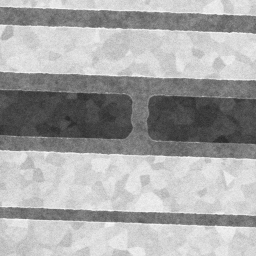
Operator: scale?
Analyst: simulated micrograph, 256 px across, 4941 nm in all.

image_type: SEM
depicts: one or a few lines or trenches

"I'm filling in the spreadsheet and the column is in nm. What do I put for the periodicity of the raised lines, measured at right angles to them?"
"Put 1260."